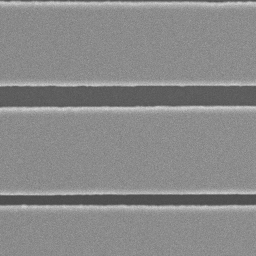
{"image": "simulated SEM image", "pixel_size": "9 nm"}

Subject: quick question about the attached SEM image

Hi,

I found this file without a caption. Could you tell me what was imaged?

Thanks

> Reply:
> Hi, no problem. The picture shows lines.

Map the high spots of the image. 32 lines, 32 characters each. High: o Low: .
oooooooooooooooooooooooooooooooo
oooooooooooooooooooooooooooooooo
oooooooooooooooooooooooooooooooo
oooooooooooooooooooooooooooooooo
oooooooooooooooooooooooooooooooo
oooooooooooooooooooooooooooooooo
oooooooooooooooooooooooooooooooo
oooooooooooooooooooooooooooooooo
oooooooooooooooooooooooooooooooo
oooooooooooooooooooooooooooooooo
oooooooooooooooooooooooooooooooo
................................
................................
oooooooooooooooooooooooooooooooo
oooooooooooooooooooooooooooooooo
oooooooooooooooooooooooooooooooo
oooooooooooooooooooooooooooooooo
oooooooooooooooooooooooooooooooo
oooooooooooooooooooooooooooooooo
oooooooooooooooooooooooooooooooo
oooooooooooooooooooooooooooooooo
oooooooooooooooooooooooooooooooo
oooooooooooooooooooooooooooooooo
oooooooooooooooooooooooooooooooo
................................
................................
oooooooooooooooooooooooooooooooo
oooooooooooooooooooooooooooooooo
oooooooooooooooooooooooooooooooo
oooooooooooooooooooooooooooooooo
oooooooooooooooooooooooooooooooo
oooooooooooooooooooooooooooooooo